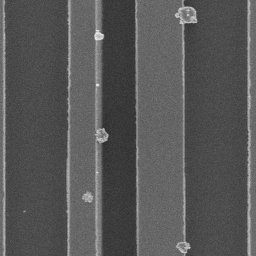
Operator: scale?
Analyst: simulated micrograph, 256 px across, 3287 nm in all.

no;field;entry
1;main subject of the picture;lines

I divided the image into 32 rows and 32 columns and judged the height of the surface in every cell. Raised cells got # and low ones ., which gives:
.........###.....######........#
.........###.....#######.......#
#........###.....#######.......#
#........###.....######........#
#........####....######........#
.........###.....######........#
.........###.....######........#
.........###.....######........#
#........###.....######........#
.........###.....######........#
#........###.....######........#
#........###.....######........#
#........###.....######........#
#........###.....######........#
#........###.....######........#
#........###.....######........#
#........####....######........#
.........####....######........#
.........###.....######........#
.........###.....######........#
#........###.....######........#
.........###.....######........#
#........###.....######........#
#........###.....######........#
#........###.....######........#
#........###.....######........#
#........###.....######........#
.........###.....######........#
#........###.....######........#
#........###.....######........#
#........###.....#######.......#
#........###.....######........#